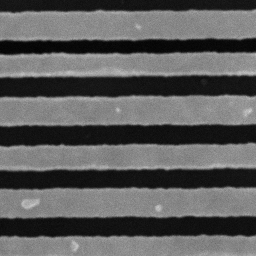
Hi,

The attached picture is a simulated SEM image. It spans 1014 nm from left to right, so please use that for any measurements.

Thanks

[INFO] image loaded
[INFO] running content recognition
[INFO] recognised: lines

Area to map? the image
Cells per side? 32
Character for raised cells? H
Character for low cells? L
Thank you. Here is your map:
LLLLLLLLLLLLLLLLLLLLLLLLLLLLLLLL
LLLHLHHHHHHHHHHHHHHHHHHHHHHHHHHH
HHHHHHHHHHHHHHHHHHHHHHHHHHHHHHHH
HHHHHHHHHHHHHHHHHHHHHHHHHHHHHHHH
HHHHHHHHHHHHHHHHHHHHHHHHHHHHHHHH
LLLLLLLLLLLLLLLLLLLLLLLLLLLLLLLL
LLLLLLLLLLLLLLLLLLLLLLLLLLLLLLLL
HHHHHHHHHHHHHHHHHHHHHHHHHHHHHHHH
HHHHHHHHHHHHHHHHHHHHHHHHHHHHHHHH
HHHHHHHHHHHHHLHHLLLLLLLLLLLLLLLL
LLLLLLLLLLLLLLLLLLLLLLLLLLLLLLLL
LLLLLLLLLLLLLLLLLLLLLLLLLLLLLLLL
HHHHHHHHHHHHHHHHHHHHHHHHHHHHHHHH
HHHHHHHHHHHHHHHHHHHHHHHHHHHHHHHH
HHHHHHHHHHHHHHHHHHHHHHHHHHHHHHHH
HHHHHHHHHHHHHHHHHHHHHHHHHLHHHHHL
LLLLLLLLLLLLLLLLLLLLLLLLLLLLLLLL
LLLLLLLLLLLLLLLLLLLLLLLLLLLLLLLL
HHHHHHHHHHHHHHHHHHHHHHHHHHHHHHHH
HHHHHHHHHHHHHHHHHHHHHHHHHHHHHHHH
HHHHHHHHHHHHHHHHHHHHHHHHHHHHHHHH
LLLLLLLLLLLLLLLLLLLLLLLLLLLLLLLL
LLLLLLLLLLLLLLLLLLLLLLLLLLLLLLLL
LLLLLLLLLLLLLLLLHLLLLLLLLLLLHLLL
HHHHHHHHHHHHHHHHHHHHHHHHHHHHHHHH
HHHHHHHHHHHHHHHHHHHHHHHHHHHHHHHH
HHHHHHHHHHHHHHHHHHHHHHHHHHHHHHHH
LLLLLLLLLLLLLLLLLLLLLLLLLLLLLLLL
LLLLLLLLLLLLLLLLLLLLLLLLLLLLLLLL
LLLLLLLLLLLLLLLLLLLLLLHLLHHHLLLL
HHHHHHHHHHHHHHHHHHHHHHHHHHHHHHHH
HHHHHHHHHHHHHHHHHHHHHHHHHHHHHHHH